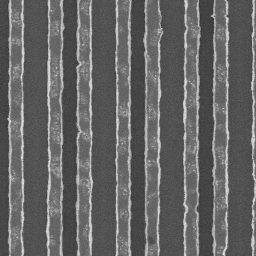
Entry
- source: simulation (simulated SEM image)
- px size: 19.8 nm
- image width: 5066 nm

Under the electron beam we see parallel lines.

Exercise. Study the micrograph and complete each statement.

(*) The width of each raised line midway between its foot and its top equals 260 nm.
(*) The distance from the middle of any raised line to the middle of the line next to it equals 673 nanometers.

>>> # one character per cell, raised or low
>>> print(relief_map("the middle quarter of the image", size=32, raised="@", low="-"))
----@@@------@@@@----@@@------@@
---@@@@------@@@@----@@@------@@
----@@@------@@@-----@@@------@@
----@@@------@@@-----@@@------@@
---@@@@------@@@-----@@@------@@
---@@@@------@@@-----@@@------@@
---@@@@------@@@-----@@@------@@
----@@@------@@@-----@@@-------@
----@@@------@@@-----@@@------@@
----@@@-------@@-----@@@------@@
---@@@@------@@@-----@@@------@@
---@@@@------@@@-----@@@------@@
---@@@@------@@@-----@@@------@@
----@@@------@@@-----@@@------@@
----@@@------@@@-----@@@------@@
----@@@------@@@-----@@@------@@
----@@@------@@@@----@@@------@@
----@@@------@@@@----@@@------@@
---@@@@------@@@-----@@@------@@
---@@@@-------@@-----@@@------@@
----@@@------@@@-----@@@------@@
----@@@------@@@-----@@@------@@
----@@@------@@@-----@@@------@@
----@@@------@@@@---@@@@------@@
----@@@------@@@----@@@-------@@
----@@@------@@@-----@@@------@@
----@@@------@@@-----@@@------@@
----@@@------@@@-----@@@------@@
----@@@------@@@-----@@@------@@
----@@@------@@@-----@@@------@@
----@@@------@@@-----@@@------@@
----@@@------@@@@---@@@@------@@